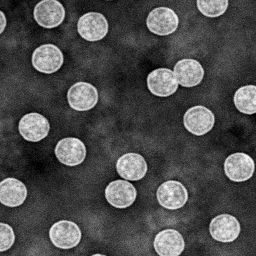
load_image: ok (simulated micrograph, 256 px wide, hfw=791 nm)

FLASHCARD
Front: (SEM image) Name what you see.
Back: a regular array of raised bodies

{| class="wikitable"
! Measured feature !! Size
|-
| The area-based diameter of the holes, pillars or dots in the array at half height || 88.8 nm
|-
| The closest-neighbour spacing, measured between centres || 159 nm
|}